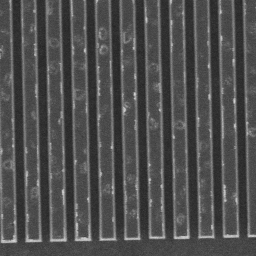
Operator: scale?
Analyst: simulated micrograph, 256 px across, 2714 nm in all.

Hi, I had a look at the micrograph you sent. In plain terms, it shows parallel lines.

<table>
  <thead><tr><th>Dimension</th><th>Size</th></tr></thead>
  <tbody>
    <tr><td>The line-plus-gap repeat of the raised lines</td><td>262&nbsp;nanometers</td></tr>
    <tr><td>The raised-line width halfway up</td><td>15.1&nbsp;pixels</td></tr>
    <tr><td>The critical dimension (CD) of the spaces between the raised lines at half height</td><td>103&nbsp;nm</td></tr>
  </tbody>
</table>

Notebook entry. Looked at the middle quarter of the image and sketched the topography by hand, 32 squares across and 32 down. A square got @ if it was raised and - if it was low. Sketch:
--@@@@--@@@@---@@@---@@@---@@@--
--@@@@--@@@@---@@@---@@@---@@@--
--@@@@--@@@@---@@@---@@@---@@@--
--@@@@--@@@@---@@@---@@@---@@@--
--@@@@--@@@@---@@@---@@@---@@@--
--@@@@--@@@@---@@@---@@@---@@@--
--@@@@--@@@@---@@@---@@@---@@@--
--@@@@--@@@@---@@@---@@@---@@@--
--@@@@--@@@@---@@@---@@@---@@@--
--@@@@--@@@@---@@@---@@@---@@@--
--@@@@--@@@@---@@@---@@@---@@@--
--@@@@---@@@---@@@---@@@---@@@--
--@@@@---@@@---@@@---@@@---@@@@-
--@@@@---@@@---@@@---@@@---@@@@-
--@@@@---@@@---@@@---@@@---@@@@-
--@@@@---@@@---@@@---@@@---@@@@-
--@@@@---@@@---@@@---@@@---@@@@-
--@@@@---@@@---@@@---@@@---@@@@-
--@@@@---@@@---@@@---@@@---@@@@-
--@@@@---@@@---@@@---@@@---@@@@-
--@@@@---@@@---@@@---@@@---@@@@-
---@@@---@@@---@@@---@@@---@@@@-
---@@@---@@@---@@@---@@@@--@@@@-
---@@@---@@@---@@@---@@@@--@@@@-
---@@@---@@@---@@@---@@@@--@@@@-
---@@@---@@@---@@@---@@@@--@@@@-
---@@@---@@@---@@@---@@@@--@@@@-
---@@@---@@@---@@@---@@@@---@@@-
---@@@---@@@---@@@---@@@@---@@@-
---@@@---@@@---@@@---@@@@--@@@@-
---@@@---@@@---@@@---@@@@--@@@@-
---@@@---@@@---@@@---@@@@--@@@@-